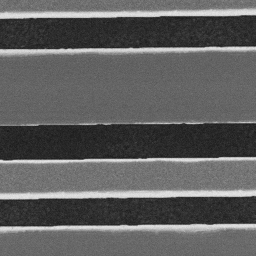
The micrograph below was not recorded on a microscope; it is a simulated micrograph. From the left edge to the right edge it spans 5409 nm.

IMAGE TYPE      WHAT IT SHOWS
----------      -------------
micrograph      lines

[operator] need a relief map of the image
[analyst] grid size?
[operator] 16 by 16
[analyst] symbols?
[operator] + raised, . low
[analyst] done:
++++++++++++++++
................
................
++++++++++++++++
++++++++++++++++
++++++++++++++++
++++++++++++++++
++++++++++++++++
................
................
++++++++++++++++
++++++++++++++++
................
................
++++++++++++++++
++++++++++++++++